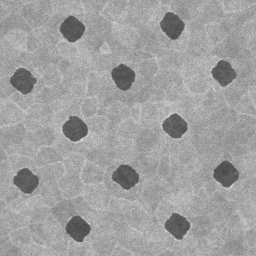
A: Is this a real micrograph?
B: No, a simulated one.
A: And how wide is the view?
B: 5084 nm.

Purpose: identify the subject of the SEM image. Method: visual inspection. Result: a regular array of holes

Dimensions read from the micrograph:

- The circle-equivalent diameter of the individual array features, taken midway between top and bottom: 494 nm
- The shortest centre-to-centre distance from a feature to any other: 1390 nanometres